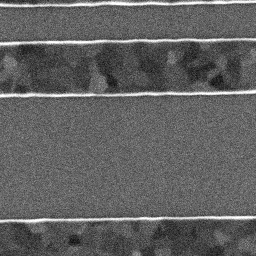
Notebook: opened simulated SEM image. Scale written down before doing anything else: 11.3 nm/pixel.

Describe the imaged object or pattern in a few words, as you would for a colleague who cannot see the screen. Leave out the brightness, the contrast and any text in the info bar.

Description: wiring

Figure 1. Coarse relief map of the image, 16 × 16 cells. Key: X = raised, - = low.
----------------
----------------
--------X-XXXXXX
XXXXXXXXXXXXXXXX
XXXXXXXXXXXXXXXX
XXXXXXXXXXXXXXXX
----------------
----------------
----------------
----------------
----------------
----------------
----------------
----------------
XXXXXXXXXXXXXXXX
XXXXXXXXXXXXXXXX